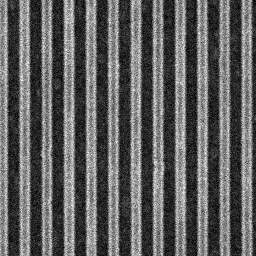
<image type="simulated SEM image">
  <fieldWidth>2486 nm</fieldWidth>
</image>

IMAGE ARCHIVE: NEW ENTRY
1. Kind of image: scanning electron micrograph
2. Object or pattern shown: parallel lines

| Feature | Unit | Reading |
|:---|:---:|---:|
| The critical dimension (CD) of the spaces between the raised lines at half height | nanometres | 138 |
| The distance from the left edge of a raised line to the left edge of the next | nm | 216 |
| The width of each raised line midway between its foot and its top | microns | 0.0826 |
